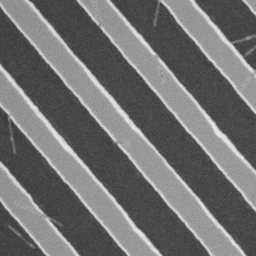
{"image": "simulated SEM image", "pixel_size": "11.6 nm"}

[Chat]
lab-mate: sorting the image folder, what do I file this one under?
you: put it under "lines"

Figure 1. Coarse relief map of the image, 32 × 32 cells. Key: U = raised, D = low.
UUUUDDDDDDUUUUDDDDDDUUUUUDDDDDDU
DUUUUDDDDDDUUUUDDDDDDUUUUDDDDDDD
DUUUUUDDDDDDUUUUDDDDDDUUUUDDDDDD
DDUUUUDDDDDDDUUUUDDDDDDUUUUDDDDD
DDDUUUUDDDDDDUUUUDDDDDDDUUUUDDDD
DDDDUUUUDDDDDDUUUUDDDDDDDUUUUDDD
DDDDDUUUUDDDDDDUUUUDDDDDDUUUUUDD
DDDDDDUUUUDDDDDDUUUUDDDDDDUUUUDD
DDDDDDDUUUUDDDDDDUUUUDDDDDDUUUUD
UDDDDDDUUUUUDDDDDDUUUUDDDDDDUUUU
UUDDDDDDUUUUDDDDDDUUUUUDDDDDDUUU
UUUDDDDDDUUUUDDDDDDUUUUDDDDDDDUU
UUUUDDDDDDUUUUDDDDDDUUUUDDDDDDUU
UUUUDDDDDDDUUUUDDDDDDUUUUDDDDDDU
DUUUUDDDDDDDUUUUDDDDDDUUUUDDDDDD
DDUUUUDDDDDDUUUUUDDDDDDUUUUDDDDD
DDDUUUUDDDDDDUUUUUDDDDDDUUUDDDDD
DDDDUUUUDDDDDDUUUUDDDDDDUUUUDDDD
DDDDUUUUUDDDDDDUUUUDDDDDDUUUUDDD
DDDDDUUUUUDDDDDDUUUUDDDDDDUUUUDD
DDDDDDUUUUDDDDDDDUUUUDDDDDDUUUUD
UDDDDDDUUUUDDDDDDDUUUUDDDDDDUUUU
UUDDDDDDUUUUDDDDDDUUUUUDDDDDDUUU
UUUDDDDDDUUUUDDDDDDUUUUUDDDDDDUU
UUUUDDDDDDUUUUDDDDDDUUUUDDDDDDUU
UUUUDDDDDDDUUUUDDDDDDUUUUDDDDDDU
DUUUUDDDDDDUUUUUDDDDDDUUUUDDDDDD
DDUUUUDDDDDDUUUUDDDDDDDUUUUDDDDD
DDDUUUUDDDDDDUUUUDDDDDDDUUUUDDDD
DDDDUUUUDDDDDDUUUUDDDDDDUUUUUDDD
DDDDDUUUUDDDDDDUUUUDDDDDDUUUUDDD
DDDDDUUUUDDDDDDDUUUUDDDDDDUUUUDD